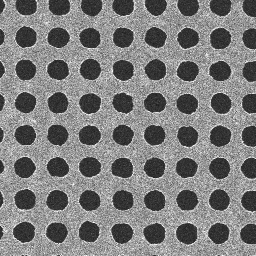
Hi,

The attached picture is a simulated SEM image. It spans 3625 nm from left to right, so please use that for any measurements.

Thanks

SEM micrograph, a regular array of holes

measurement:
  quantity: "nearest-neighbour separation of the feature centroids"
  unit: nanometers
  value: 453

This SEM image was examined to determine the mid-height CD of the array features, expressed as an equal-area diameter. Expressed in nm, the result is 298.